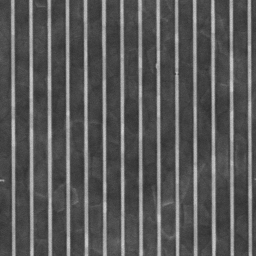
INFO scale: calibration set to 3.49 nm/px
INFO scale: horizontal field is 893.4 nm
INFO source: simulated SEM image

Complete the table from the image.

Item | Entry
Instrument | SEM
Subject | parallel lines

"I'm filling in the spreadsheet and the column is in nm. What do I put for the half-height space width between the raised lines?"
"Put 56.7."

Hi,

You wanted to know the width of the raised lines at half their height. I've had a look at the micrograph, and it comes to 2.49 pixels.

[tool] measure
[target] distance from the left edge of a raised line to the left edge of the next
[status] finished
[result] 63.5 nm